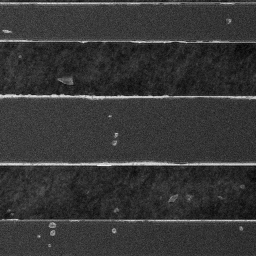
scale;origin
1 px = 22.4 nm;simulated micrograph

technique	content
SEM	lines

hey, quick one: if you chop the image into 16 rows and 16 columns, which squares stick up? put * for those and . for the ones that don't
****************
****************
****************
................
................
................
****************
****************
****************
****************
................
................
................
................
****************
****************